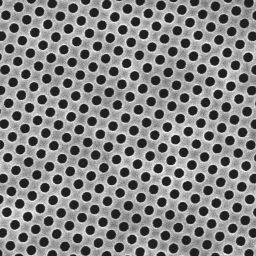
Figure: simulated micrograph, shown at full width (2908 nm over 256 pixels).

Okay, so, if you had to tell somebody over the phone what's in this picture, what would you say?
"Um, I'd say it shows a regular array of holes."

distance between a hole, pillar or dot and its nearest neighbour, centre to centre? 170 nm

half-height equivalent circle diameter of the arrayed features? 9.9 pixels